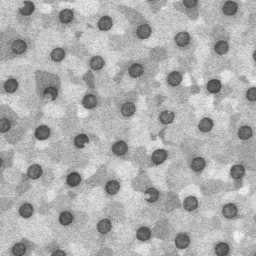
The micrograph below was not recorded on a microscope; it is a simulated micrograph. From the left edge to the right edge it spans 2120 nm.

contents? a regular array of holes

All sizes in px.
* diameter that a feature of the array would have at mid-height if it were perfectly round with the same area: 15.7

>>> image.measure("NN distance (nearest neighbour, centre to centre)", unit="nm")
326